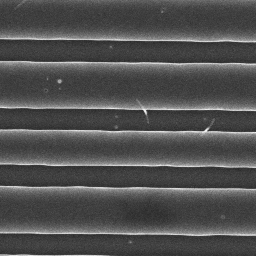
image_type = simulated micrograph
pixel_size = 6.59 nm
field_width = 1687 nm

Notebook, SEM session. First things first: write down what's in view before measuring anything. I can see wiring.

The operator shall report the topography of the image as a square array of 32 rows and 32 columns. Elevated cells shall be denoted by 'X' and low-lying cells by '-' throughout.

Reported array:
XXXXXXXXXXXXXXXXXXXXXXXXXXXXXXXX
XXXXXXXXXXXXXXXXXXXXXXXXXXXXXXXX
XXXXXXXXXXXXXXXXXXXXXXXXXXXXXXXX
XXXXXXXXXXXXXXXXXXXXXXXXXXXXXXXX
XXXXXXXXXXXXXXXXXXXXXXXXXXXXXXXX
--------------------------------
--------------------------------
--------------------------------
XXXXXXXXXXXXXXXXXXXXXXXXXXXXXXXX
XXXXXXXXXXXXXXXXXXXXXXXXXXXXXXXX
XXXXXXXXXXXXXXXXXXXXXXXXXXXXXXXX
XXXXXXXXXXXXXXXXXXXXXXXXXXXXXXXX
XXXXXXXXXXXXXXXXXXXXXXXXXXXXXXXX
XXXXXXXXXXXXXXXXXXXXXXXXXXXXXXXX
--------------------------------
--------------------------------
XXXXXXXXXXXXXXXXXXXXXXXXXXXXX---
XXXXXXXXXXXXXXXXXXXXXXXXXXXXXXXX
XXXXXXXXXXXXXXXXXXXXXXXXXXXXXXXX
XXXXXXXXXXXXXXXXXXXXXXXXXXXXXXXX
XXXXXXXXXXXXXXXXXXXXXXXXXXXXXXXX
--------------------------------
--------------------------------
XXXXXXXXXXXXX-------------------
XXXXXXXXXXXXXXXXXXXXXXXXXXXXXXXX
XXXXXXXXXXXXXXXXXXXXXXXXXXXXXXXX
XXXXXXXXXXXXXXXXXXXXXXXXXXXXXXXX
XXXXXXXXXXXXXXXXXXXXXXXXXXXXXXXX
XXXXXXXXXXXXXXXXXXXXXXXXXXXXXXXX
--------------------------------
--------------------------------
--------------------------------